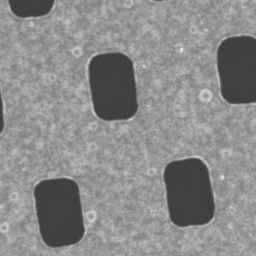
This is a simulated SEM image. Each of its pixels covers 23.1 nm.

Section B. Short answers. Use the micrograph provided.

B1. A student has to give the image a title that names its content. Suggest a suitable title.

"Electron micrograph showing holes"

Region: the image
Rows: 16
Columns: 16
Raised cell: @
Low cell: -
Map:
@--@@@@@@@@@@@@@
@@@@@@@@@@@@@@@@
@@@@@@@@@@@@@@--
@@@@@@--@@@@@@--
@@@@@@--@@@@@@--
@@@@@@---@@@@@--
@@@@@@---@@@@@@@
@@@@@@@-@@@@@@@@
@@@@@@@@@@@@@@@@
@@@@@@@@@@@@@@@@
@@@@@@@@@@---@@@
@@---@@@@@---@@@
@@---@@@@@---@@@
@@---@@@@@@--@@@
@@---@@@@@@@@@@@
@@@@@@@@@@@@@@@@